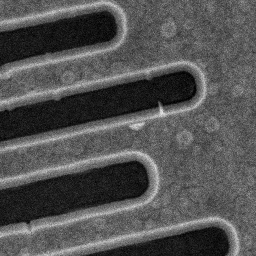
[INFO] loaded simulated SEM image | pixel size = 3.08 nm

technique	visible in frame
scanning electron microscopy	one or a few lines or trenches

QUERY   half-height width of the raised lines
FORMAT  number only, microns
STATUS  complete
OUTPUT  0.111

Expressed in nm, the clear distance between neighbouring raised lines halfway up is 122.